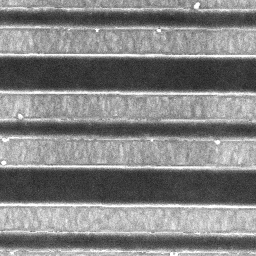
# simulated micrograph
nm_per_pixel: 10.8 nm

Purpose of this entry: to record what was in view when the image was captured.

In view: lines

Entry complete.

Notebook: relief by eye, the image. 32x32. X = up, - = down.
--------------------------------
XXXXXXXXXXXXXXXXXXXXXXXXXXXXXXXX
XXXXXXXXXXXXXXXXXXXXXXXXXXXXXXXX
------------X-X--XXXXXXXXXXXXXXX
--------------------------------
--------------------------------
--------------------------------
XXXXXXXXXXXXXXXXXXXXXXXXXXXXXXXX
XXXXXXXXXXXXXXXXXXXXXXXXXXXXXXXX
XXXXXXXXXXXXXXXXXXXXXXXXXXXXXXXX
XXXXXXXXXXXXXXXXXXXXXXXXXXXXXXXX
-XXXXXXXXXXXXXXXXXXXXXXXXXXXXXXX
--------------------------------
--------------------------------
--------------------------------
XXXXXXXXXXXXXXXXXXXXXXXXXXXXXXXX
XXXXXXXXXXXXXXXXXXXXXXXXXXXXXXXX
---------------------------X----
--------------------------------
--------------------------------
--------------------------------
XXXXXXXXXXXXXXXXXXXXXXXXXXXXXXXX
XXXXXXXXXXXXXXXXXXXXXXXXXXXXXXXX
XXXXXXXXXXXXXXXXXXXXXXXXXXXXXXXX
XXXXXXXXXXXXXXXXXXXXXXXXXXXXXXXX
XXXXXXXXXXXXXXXXXXXXXXXXXXXXXXXX
--------------------------------
--------------------------------
--------------------------------
XXXXXXXXXXXXXXXXXXXXXXXXXXXXXXXX
XXXXXXXXXXXXXXXXXXXXXXXXXXXXXXXX
---------------------XXXX-XXXXXX